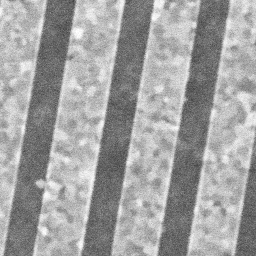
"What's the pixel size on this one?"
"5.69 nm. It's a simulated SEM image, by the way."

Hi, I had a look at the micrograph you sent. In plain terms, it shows one or a few lines or trenches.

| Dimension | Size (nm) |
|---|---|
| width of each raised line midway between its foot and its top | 252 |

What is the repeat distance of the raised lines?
75.8 pixels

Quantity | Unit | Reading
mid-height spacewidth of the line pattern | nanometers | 174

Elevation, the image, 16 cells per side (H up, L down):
HHHLLHHHLLHHLLHH
HHHLLHHLLHHHLLHH
HHLLHHHLLHHHLLHH
HHLLHHHLLHHHLLHH
HHLLHHHLLHHHLLHH
HHLLHHHLLHHHLLHH
HHLLHHHLLHHLLHHH
HHLLHHLLHHHLLHHH
HLLHHHLLHHHLLHHH
HLLHHHLLHHHLLHHH
HLLHHHLLHHHLLHHH
HLLHHHLLHHHLLHHL
HLLHHHLLHHLLHHHL
HLLHHLLHHHLLHHHL
LLHHHLLHHHLLHHHL
LLHHHLLHHHLLHHHL